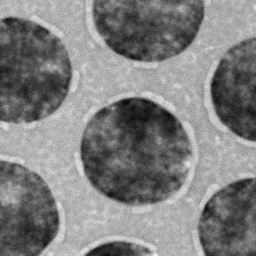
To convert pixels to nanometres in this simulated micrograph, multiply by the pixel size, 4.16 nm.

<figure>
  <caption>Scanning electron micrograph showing holes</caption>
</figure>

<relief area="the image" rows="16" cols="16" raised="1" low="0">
1111110000000111
0011110000000111
0000110000001110
0000111100011100
0000111111111000
0000111111111000
0000111000111000
0011110000011100
1111100000001110
1111100000001111
0011100000001111
0001110000011100
0001111000111000
0000111111111000
0000111111110000
0001110001111000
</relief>